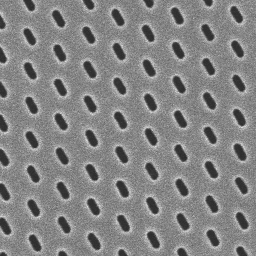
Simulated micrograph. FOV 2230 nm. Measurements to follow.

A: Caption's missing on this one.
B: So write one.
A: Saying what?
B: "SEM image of a regular array of holes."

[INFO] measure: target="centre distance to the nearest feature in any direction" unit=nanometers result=296